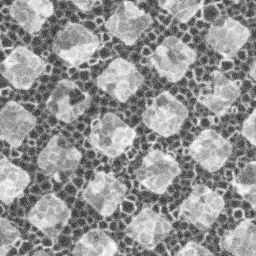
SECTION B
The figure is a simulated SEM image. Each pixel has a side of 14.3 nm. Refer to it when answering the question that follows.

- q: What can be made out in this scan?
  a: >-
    a regular array of raised bodies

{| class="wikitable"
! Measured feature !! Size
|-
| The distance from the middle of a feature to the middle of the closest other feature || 805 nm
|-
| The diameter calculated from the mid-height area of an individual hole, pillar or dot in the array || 530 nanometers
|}